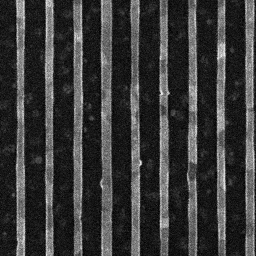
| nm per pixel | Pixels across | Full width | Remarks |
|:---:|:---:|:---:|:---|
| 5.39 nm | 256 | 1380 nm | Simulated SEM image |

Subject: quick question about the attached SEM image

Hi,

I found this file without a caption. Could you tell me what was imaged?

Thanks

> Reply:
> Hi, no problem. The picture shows parallel lines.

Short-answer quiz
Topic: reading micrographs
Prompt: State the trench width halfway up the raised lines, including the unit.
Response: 115 nm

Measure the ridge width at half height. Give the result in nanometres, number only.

41.7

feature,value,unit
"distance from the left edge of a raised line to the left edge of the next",154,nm